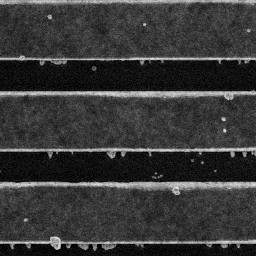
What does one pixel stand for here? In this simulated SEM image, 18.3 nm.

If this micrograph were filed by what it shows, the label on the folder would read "lines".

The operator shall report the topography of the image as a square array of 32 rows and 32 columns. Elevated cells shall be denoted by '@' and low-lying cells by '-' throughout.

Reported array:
@@@@@@@@@@@@@@@@@@@@@@@@@@@@@@@@
@@@@@@@@@@@@@@@@@@@@@@@@@@@@@@@@
@@@@@@@@@@@@@@@@@@@@@@@@@@@@@@@@
@@@@@@@@@@@@@@@@@@@@@@@@@@@@@@@@
@@@@@@@@@@@@@@@@@@@@@@@@@@@@@@@@
@@@@@@@@@@@@@@@@@@@@@@@@@@@@@@@@
@@@@@@@@@@@@@@@@@@@@@@@@@@@@@@@@
--------------------------------
--------------------------------
--------------------------------
--------------------------------
@@------@@@@@--------------@@@@@
@@@@@@@@@@@@@@@@@@@@@@@@@@@@@@@@
@@@@@@@@@@@@@@@@@@@@@@@@@@@@@@@@
@@@@@@@@@@@@@@@@@@@@@@@@@@@@@@@@
@@@@@@@@@@@@@@@@@@@@@@@@@@@@@@@@
@@@@@@@@@@@@@@@@@@@@@@@@@@@@@@@@
@@@@@@@@@@@@@@@@@@@@@@@@@@@@@@@@
@@@@@@@@@@@@@@@@@@@@@@@@@@@@@@@@
--------------------------------
--------------------------------
--------------------------------
--------------------------------
@@@@@@@@@@@@@@@@@@@@@@@@@@@@@@@@
@@@@@@@@@@@@@@@@@@@@@@@@@@@@@@@@
@@@@@@@@@@@@@@@@@@@@@@@@@@@@@@@@
@@@@@@@@@@@@@@@@@@@@@@@@@@@@@@@@
@@@@@@@@@@@@@@@@@@@@@@@@@@@@@@@@
@@@@@@@@@@@@@@@@@@@@@@@@@@@@@@@@
@@@@@@@@@@@@@@@@@@@@@@@@@@@@@@@@
------@@------------------------
--------------------------------